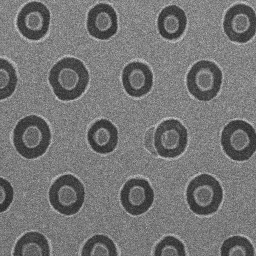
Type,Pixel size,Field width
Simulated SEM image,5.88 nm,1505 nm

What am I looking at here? a regular array of ring-shaped grooves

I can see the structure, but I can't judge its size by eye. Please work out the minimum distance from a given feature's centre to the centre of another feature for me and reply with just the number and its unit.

0.39 micrometres